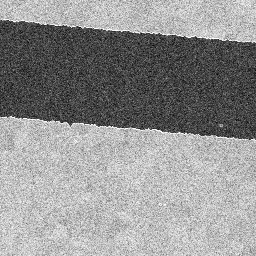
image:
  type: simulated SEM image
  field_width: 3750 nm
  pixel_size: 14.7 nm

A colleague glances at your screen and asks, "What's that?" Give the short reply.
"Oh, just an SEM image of one or a few lines or trenches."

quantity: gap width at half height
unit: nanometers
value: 1420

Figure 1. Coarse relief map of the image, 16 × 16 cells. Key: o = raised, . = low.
oooooooooooooooo
...ooooooooooooo
..............oo
................
................
................
................
oo..............
ooooooooooooo...
oooooooooooooooo
oooooooooooooooo
oooooooooooooooo
oooooooooooooooo
oooooooooooooooo
oooooooooooooooo
oooooooooooooooo